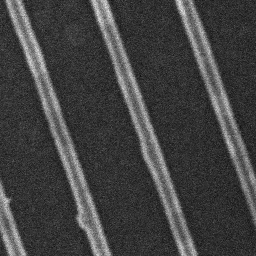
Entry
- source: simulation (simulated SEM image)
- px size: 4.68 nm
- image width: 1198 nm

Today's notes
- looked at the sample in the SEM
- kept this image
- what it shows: one or a few lines or trenches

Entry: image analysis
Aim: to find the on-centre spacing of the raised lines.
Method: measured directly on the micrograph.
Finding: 377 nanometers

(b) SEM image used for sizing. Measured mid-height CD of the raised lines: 52.4 nanometres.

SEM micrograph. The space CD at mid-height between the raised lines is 322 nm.